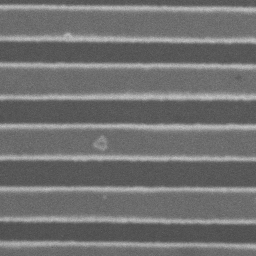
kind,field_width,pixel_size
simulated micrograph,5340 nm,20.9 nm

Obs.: lines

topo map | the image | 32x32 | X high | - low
--------------------------------
XXXXXXXXXXXXXXXXXXXXXXXXXXXXXXXX
XXXXXXXXXXXXXXXXXXXXXXXXXXXXXXXX
XXXXXXXXXXXXXXXXXXXXXXXXXXXXXXXX
XXXXXXXXXXXXXXXXXXXXXXXXXXXXXXXX
--------------------------------
--------------------------------
--------------------------------
XXXXXXXXXXXXXXXXXXXXXXXXXXXXXXXX
XXXXXXXXXXXXXXXXXXXXXXXXXXXXXXXX
XXXXXXXXXXXXXXXXXXXXXXXXXXXXXXXX
XXXXXXXXXXXXXXXXXXXXXXXXXXXXXXXX
--------------------------------
--------------------------------
--------------------------------
--------------------------------
XXXXXXXXXXXXXXXXXXXXXXXXXXXXXXXX
XXXXXXXXXXXXXXXXXXXXXXXXXXXXXXXX
XXXXXXXXXXXXXXXXXXXXXXXXXXXXXXXX
XXXXXXXXXXXXXXXXXXXXXXXXXXXXXXXX
--------------------------------
--------------------------------
--------------------------------
XX-XX--X--XX--------------------
XXXXXXXXXXXXXXXXXXXXXXXXXXXXXXXX
XXXXXXXXXXXXXXXXXXXXXXXXXXXXXXXX
XXXXXXXXXXXXXXXXXXXXXXXXXXXXXXXX
XXXXXXXXXXXXXXXXXXXXXXXXXXXXXXXX
--------------------------------
--------------------------------
XXXXXXXXXXXXXXXXXXXXXXXXX-------
XXXXXXXXXXXXXXXXXXXXXXXXXXXXXXXX